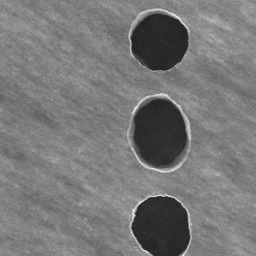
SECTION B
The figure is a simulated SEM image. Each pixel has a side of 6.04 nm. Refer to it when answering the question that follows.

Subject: holes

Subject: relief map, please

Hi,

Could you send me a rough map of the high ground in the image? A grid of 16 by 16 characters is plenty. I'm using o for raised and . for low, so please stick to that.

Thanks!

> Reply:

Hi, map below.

oooooooooooooooo
ooooooooo..ooooo
oooooooo....oooo
oooooooo...ooooo
oooooooooooooooo
oooooooooooooooo
ooooooooo..ooooo
oooooooo...ooooo
oooooooo....oooo
oooooooo....oooo
oooooooooooooooo
oooooooooooooooo
ooooooooo..ooooo
oooooooo....oooo
oooooooo....oooo
ooooooooo...oooo